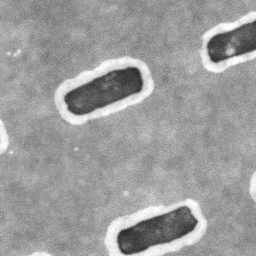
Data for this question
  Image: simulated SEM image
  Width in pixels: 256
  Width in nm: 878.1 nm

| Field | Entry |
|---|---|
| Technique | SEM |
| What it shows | holes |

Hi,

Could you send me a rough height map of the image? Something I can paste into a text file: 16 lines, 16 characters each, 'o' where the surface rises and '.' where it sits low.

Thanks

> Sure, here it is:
oooooooooooooooo
ooooooooooooooo.
ooooooooooooo...
ooooooooooooo..o
oooooo...ooooooo
oooo.....ooooooo
oooo...ooooooooo
oooooooooooooooo
oooooooooooooooo
oooooooooooooooo
oooooooooooooooo
oooooooooooooooo
oooooooooooooooo
ooooooooo...oooo
ooooooo.....oooo
ooooooo...oooooo